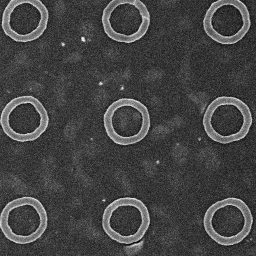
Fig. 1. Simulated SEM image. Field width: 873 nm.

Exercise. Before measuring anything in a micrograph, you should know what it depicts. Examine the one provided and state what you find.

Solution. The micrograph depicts ring-shaped raised bodies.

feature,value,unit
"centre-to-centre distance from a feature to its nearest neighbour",340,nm